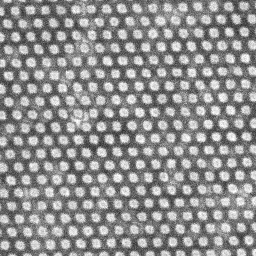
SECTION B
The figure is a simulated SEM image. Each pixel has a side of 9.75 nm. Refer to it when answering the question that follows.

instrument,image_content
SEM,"a regular array of raised bodies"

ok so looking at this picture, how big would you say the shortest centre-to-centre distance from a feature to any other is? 14.7 px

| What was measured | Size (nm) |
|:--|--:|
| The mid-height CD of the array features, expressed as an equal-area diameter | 78.6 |